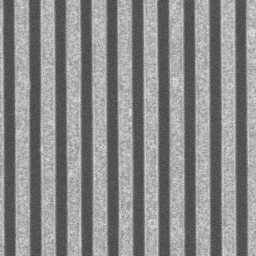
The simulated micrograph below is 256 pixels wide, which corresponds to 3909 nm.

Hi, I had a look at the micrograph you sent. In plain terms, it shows parallel lines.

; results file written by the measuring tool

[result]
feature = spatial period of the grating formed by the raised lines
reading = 394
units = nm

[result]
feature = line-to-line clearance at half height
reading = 187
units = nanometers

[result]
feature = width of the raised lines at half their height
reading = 214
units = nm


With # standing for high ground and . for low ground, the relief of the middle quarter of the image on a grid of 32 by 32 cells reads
.###...###....###...###...####..
.###...###....###...###...####..
.###...####...###...###....###..
.###...####...###...###....###..
.###...####...###...###....###..
.###...###....###...###....###..
.###...###....###...###....###..
.###...###....###...###....###..
.###...###....###...###....###..
.###...###....###...###....###..
.###...###....###...###....###..
.###...###....###...###....###..
.###...###....###...###....###..
.###...###....###...###....###..
.###...###....###...###....###..
.###...###....###...###....###..
.###...###....###...###....###..
.###...###....###...###....###..
.###...###....###...###....###..
.###...###....###...###....###..
.###...###....###...###....###..
.###...###....###...###....###..
.###...###....###...###....###..
.###...###....###...###....###..
.###...###....###...###....###..
.###...###....###...###....###..
.###...###....###...###....###..
.###...###....###...###....###..
.###...###....###...###....###..
.###...###....###...###....###..
.###...###....###...###....###..
.###...###....###...###....###..